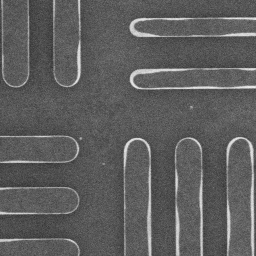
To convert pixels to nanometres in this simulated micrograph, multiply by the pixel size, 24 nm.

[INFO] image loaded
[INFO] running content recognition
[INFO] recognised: groups of lines, slits or small figures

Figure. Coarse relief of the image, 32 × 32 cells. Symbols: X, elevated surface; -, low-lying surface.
XXXX---XXX----------------------
XXXX---XXX----------------------
XXXX---XXX-------XXXXXXXXXXXXXXX
XXXX---XXX------XXXXXXXXXXXXXXXX
XXXX---XXX---------XXXXX--------
XXXX---XXX----------------------
XXXX---XXX----------------------
XXXX---XXX----------------------
XXXX---XXX----------------------
XXXX---XXX-------XXXXXXXXXXXXXXX
-XX----XX--------XXXXXXXXXXXXXXX
--------------------------------
--------------------------------
--------------------------------
--------------------------------
--------------------------------
--------------------------------
XXXXXXXXX--------X-----X-----XX-
XXXXXXXXXX------XXX---XXX----XX-
XXXXXXXXXX------XXX---XXX---XXXX
----------------XXX---XXX---XXXX
----------------XXX---XXX---XXXX
----------------XXX---XXX---XXXX
----------------XXX---XXX---XXXX
XXXXXXXXXX------XXX---XXX---XXXX
XXXXXXXXXX------XXX---XXX---XXXX
XXXXXXXXX-------XXX---XXX----XXX
----------------XXX---XXX----XXX
----------------XXX---XXX----XXX
----------------XXX---XXX----XXX
XXXXXXXXX-------XXX---XXX---XXXX
XXXXXXXXXX------XXX---XXX---XXXX